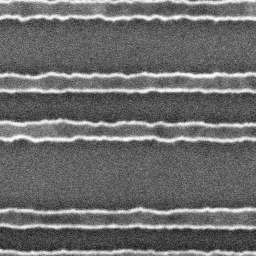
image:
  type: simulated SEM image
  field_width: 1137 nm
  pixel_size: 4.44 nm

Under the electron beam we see lines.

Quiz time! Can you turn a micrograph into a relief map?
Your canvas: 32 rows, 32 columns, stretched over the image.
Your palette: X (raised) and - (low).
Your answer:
XXXXXXXXXXXXXXXXXXXXXXXXXXXXXXXX
XXXXXXXXXXXXXXXXXXXXXXXXXXXXXXXX
--------------------------------
--------------------------------
--------------------------------
--------------------------------
--------------------------------
--------------------------------
--------------------------------
XXX--XXXXXXXXXXXXXXXXXXXXXXXXXXX
XXXXXXXXXXXXXXXXXXXXXXXXXXXXXXXX
--------------------------------
--------------------------------
--------------------------------
--------------------------------
XXXXXXXXXXXXXXXXXXXXX-XXXX-----X
XXXXXXXXXXXXXXXXXXXXXXXXXXXXXXXX
----XXXXX------X----XX-X--XXXX--
--------------------------------
--------------------------------
--------------------------------
--------------------------------
--------------------------------
--------------------------------
--------------------------------
--------------------------------
XXXXX--XXXXXXXXXXXXX-XXXXXXXXXXX
XXXXXXXXXXXXXXXXXXXXXXXXXXXXXXXX
----------------------------XX-X
--------------------------------
--------------------------------
XX-----XXX----XXXXX----XX-------